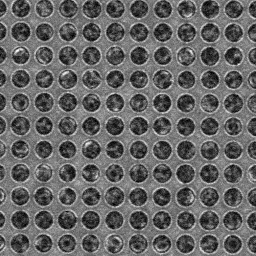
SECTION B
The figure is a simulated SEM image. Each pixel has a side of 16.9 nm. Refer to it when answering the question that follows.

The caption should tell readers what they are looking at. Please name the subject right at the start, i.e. a regular array of holes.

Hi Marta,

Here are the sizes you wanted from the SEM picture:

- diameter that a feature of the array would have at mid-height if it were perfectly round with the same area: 319 nm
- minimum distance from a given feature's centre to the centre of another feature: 0.393 µm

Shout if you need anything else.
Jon